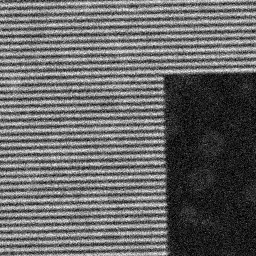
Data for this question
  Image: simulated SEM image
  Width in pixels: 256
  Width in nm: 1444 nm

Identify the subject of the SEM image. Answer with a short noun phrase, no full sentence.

parallel lines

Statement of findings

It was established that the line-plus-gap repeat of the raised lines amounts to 39.5 nanometers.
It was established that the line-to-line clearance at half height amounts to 4.75 px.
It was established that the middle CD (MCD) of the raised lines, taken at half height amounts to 10.6 nanometres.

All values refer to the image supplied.